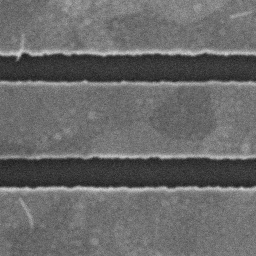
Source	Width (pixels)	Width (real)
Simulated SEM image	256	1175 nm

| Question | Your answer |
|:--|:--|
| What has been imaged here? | lines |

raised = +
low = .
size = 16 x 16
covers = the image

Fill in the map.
++++++++++++++++
++++++++++++++++
++++++++++++++++
................
................
++++++++++++++++
++++++++++++++++
++++++++++++++++
++++++++++++++++
++++++++++++++++
................
................
++++++++++++++++
++++++++++++++++
++++++++++++++++
++++++++++++++++